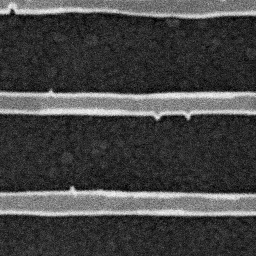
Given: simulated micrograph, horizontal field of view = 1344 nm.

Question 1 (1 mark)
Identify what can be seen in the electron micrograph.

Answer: one or a few lines or trenches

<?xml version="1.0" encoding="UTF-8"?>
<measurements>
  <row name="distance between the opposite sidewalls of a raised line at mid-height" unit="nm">97.9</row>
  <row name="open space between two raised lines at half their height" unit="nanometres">424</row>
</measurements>